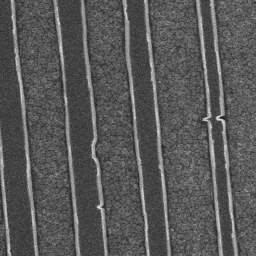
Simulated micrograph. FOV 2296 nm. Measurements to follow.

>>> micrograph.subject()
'one or a few lines or trenches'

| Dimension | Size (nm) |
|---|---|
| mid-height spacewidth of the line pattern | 374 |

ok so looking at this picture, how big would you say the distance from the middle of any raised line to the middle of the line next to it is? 0.61 µm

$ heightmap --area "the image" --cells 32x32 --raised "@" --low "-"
@@-----@@@------@@-------@@-----
@@-----@@@------@@-------@@-----
@@-----@@@------@@-------@@-----
@@-----@@@@-----@@@------@@-----
@@-----@@@@-----@@@------@@-----
@@------@@@-----@@@------@@-----
@@------@@@-----@@@------@@-----
@@------@@@-----@@@------@@-----
@@------@@@-----@@@-------@-----
@@------@@@-----@@@-------@@----
@@@-----@@@-----@@@-------@@----
@@@-----@@@-----@@@-------@@----
@@@-----@@@@-----@@-------@@----
@@@-----@@@@-----@@@------@@----
@@@-----@@@@-----@@@------@@----
@@@-----@@@@-----@@@------@@----
@@@-----@@@@-----@@@------@@----
@@@------@@@-----@@@------@@----
@@@------@@@-----@@@------@@----
@@@@-----@@@-----@@@------@@----
@@@@-----@@@-----@@@-------@----
@@@@-----@@@-----@@@-------@@---
@@@@-----@@@------@@-------@@---
@@@@-----@@@@-----@@@------@@---
@@@@-----@@@@-----@@@------@@---
-@@@-----@@@@-----@@@------@@---
-@@@-----@@@@-----@@@------@@---
-@@@-----@@@@-----@@@------@@---
-@@@-----@@@@-----@@@------@@---
-@@@------@@@-----@@@------@@---
-@@@------@@@-----@@@-------@---
-@@@@-----@@@-----@@@-------@@--